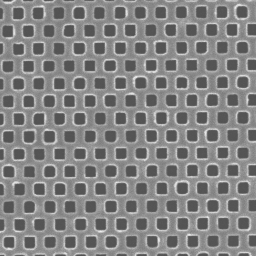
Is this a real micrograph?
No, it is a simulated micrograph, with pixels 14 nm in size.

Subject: a regular array of holes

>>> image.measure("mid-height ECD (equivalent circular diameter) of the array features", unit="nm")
175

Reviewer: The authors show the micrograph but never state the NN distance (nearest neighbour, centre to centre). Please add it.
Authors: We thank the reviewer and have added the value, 0.278 microns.